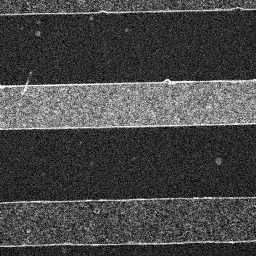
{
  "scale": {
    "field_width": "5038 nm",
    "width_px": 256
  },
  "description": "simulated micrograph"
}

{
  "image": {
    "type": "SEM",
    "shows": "one or a few lines or trenches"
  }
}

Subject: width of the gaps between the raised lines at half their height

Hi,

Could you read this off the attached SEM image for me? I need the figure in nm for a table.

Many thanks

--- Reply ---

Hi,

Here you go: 1430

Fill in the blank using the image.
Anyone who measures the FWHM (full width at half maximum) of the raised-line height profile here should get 43.5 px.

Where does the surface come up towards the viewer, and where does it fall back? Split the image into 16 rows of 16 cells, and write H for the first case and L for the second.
HHHHHHHHHHHHHHHH
LLLLLLLLLLLLLLLL
LLLLLLLLLLLLLLLL
LLLLLLLLLLLLLLLL
LLLLLLLLLLLLLLLL
HHHHHHHHHHHHHHHH
HHHHHHHHHHHHHHHH
HHHHHHHHHHHHHHHH
LLLLLLLLLLLLLLLL
LLLLLLLLLLLLLLLL
LLLLLLLLLLLLLLLL
LLLLLLLLLLLLLLLL
LLLLLLLLLHHHHHHH
HHHHHHHHHHHHHHHH
HHHHHHHHHHHHHHHH
LLLLLLLLLLLLLLLL